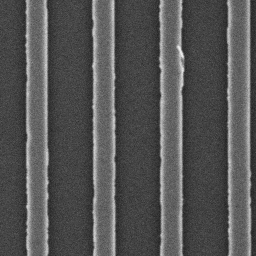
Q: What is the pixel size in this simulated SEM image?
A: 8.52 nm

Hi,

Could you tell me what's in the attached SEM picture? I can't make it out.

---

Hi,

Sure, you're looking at lines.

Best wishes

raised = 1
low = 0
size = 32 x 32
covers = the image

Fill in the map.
00011100000011000000111000001110
00011100000011000000111000000110
00011100000011000000111000000110
00011100000011000000111000001110
00011100000011000000111000001110
00011100000011000000111000000110
00011100000011000000111000000110
00011100000011000000111000000110
00011100000011000000111000000110
00011100000011000000111000000110
00011100000011000000111000000110
00011100000011000000111000001110
00011100000011000000111000001110
00011100000011000000111000000110
00011100000011000000111000000110
00011100000011000000111000000110
00011100000011000000111000000110
00011100000011000000111000000110
00011100000011000000111000000110
00011100000011000000111000000110
00011100000011000000111000000110
00011100000011000000111000000110
00011100000011000000111000000110
00011100000011000000111000000110
00011100000011000000111000000110
00011100000011000000111000000110
00011100000011000000111000000110
00011100000011000000111000000110
00011100000011000000111000000110
00011100000011000000111000000110
00011100000011000000111000000110
00011100000011000000111000000110